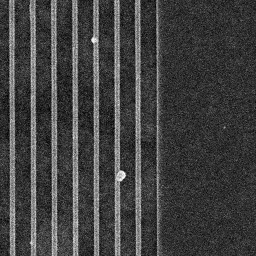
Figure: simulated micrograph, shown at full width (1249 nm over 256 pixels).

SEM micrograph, parallel lines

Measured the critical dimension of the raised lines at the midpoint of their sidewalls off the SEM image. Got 21.4 nm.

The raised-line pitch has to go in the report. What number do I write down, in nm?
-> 102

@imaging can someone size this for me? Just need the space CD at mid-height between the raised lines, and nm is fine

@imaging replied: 80